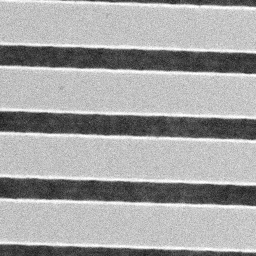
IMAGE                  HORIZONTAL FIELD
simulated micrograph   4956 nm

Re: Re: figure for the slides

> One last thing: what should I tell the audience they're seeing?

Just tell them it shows lines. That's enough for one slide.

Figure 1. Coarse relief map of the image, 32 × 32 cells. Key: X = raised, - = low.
XXXXXXXXXXXXXXXXXX--------------
XXXXXXXXXXXXXXXXXXXXXXXXXXXXXXXX
XXXXXXXXXXXXXXXXXXXXXXXXXXXXXXXX
XXXXXXXXXXXXXXXXXXXXXXXXXXXXXXXX
XXXXXXXXXXXXXXXXXXXXXXXXXXXXXXXX
XXXXXXXXXXXXXXXXXXXXXXXXXXXXXXXX
-------------------------------X
--------------------------------
XXXXXX--------------------------
XXXXXXXXXXXXXXXXXXXXXXXXXXXXXXXX
XXXXXXXXXXXXXXXXXXXXXXXXXXXXXXXX
XXXXXXXXXXXXXXXXXXXXXXXXXXXXXXXX
XXXXXXXXXXXXXXXXXXXXXXXXXXXXXXXX
XXXXXXXXXXXXXXXXXXXXXXXXXXXXXXXX
---------------------XXXXXXXXXXX
--------------------------------
--------------------------------
XXXXXXXXXXXXXXXXXXXXXXXXXXXXXXX-
XXXXXXXXXXXXXXXXXXXXXXXXXXXXXXXX
XXXXXXXXXXXXXXXXXXXXXXXXXXXXXXXX
XXXXXXXXXXXXXXXXXXXXXXXXXXXXXXXX
XXXXXXXXXXXXXXXXXXXXXXXXXXXXXXXX
------------XXXXXXXXXXXXXXXXXXXX
--------------------------------
--------------------------------
XXXXXXXXXXXXXXXXXXXXXXXX--------
XXXXXXXXXXXXXXXXXXXXXXXXXXXXXXXX
XXXXXXXXXXXXXXXXXXXXXXXXXXXXXXXX
XXXXXXXXXXXXXXXXXXXXXXXXXXXXXXXX
XXXXXXXXXXXXXXXXXXXXXXXXXXXXXXXX
--XXXXXXXXXXXXXXXXXXXXXXXXXXXXXX
--------------------------------